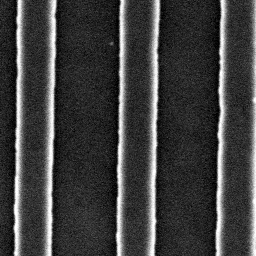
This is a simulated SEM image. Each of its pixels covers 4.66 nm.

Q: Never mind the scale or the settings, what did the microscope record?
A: lines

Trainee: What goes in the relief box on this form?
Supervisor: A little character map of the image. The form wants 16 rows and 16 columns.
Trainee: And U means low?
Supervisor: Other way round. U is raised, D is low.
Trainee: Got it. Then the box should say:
DUUDDDDDUUDDDDUU
DUUDDDDDUUDDDDUU
DUUDDDDDUUDDDDUU
DUUDDDDDUUDDDDUU
DUUDDDDUUUDDDDUU
DUUDDDDDUUDDDDUU
DUUDDDDUUUDDDDUU
DUUDDDDUUUDDDDUU
DUUDDDDUUUDDDDUU
DUUDDDDUUUDDDDUU
DUUDDDDUUUDDDDUU
DUUDDDDUUUDDDDUU
DUUDDDDUUUDDDDUU
DUUDDDDUUUDDDDUU
DUUDDDDUUUDDDDUU
DUUDDDDUUUDDDDUU